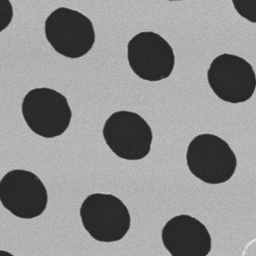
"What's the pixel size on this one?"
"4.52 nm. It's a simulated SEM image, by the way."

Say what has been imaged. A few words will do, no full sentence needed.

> holes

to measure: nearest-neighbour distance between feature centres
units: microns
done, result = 0.374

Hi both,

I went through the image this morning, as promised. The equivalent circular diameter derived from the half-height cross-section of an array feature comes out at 222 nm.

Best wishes